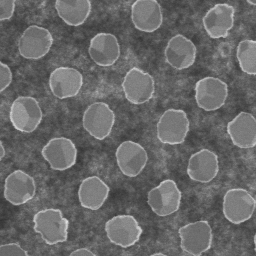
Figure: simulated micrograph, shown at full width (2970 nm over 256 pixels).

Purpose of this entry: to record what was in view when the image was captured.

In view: a regular array of raised bodies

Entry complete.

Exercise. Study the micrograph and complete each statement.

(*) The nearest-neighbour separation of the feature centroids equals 50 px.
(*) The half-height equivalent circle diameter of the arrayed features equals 373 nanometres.